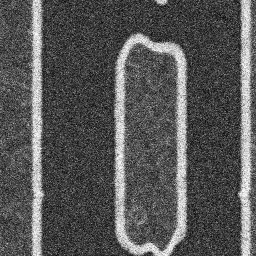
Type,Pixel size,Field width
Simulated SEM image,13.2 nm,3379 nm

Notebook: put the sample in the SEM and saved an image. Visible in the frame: one or a few lines or trenches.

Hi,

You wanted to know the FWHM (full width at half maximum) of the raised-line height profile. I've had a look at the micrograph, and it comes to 810 nanometres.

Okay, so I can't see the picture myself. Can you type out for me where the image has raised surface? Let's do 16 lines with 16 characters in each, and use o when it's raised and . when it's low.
oo.............o
oo.............o
oo.............o
oo......ooo....o
oo......ooo....o
oo......ooo....o
oo.....oooo....o
oo......ooo....o
oo......ooo....o
oo.....oooo....o
oo.....oooo....o
oo......ooo....o
oo.....oooo....o
oo......ooo....o
oo......ooo....o
oo......ooo....o